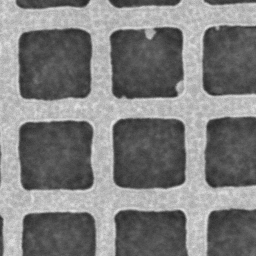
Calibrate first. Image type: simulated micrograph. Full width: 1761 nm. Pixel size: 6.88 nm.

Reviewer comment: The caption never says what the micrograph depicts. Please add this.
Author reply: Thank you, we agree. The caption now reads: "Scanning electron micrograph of holes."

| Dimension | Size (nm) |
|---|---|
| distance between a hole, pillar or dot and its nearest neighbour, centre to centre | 625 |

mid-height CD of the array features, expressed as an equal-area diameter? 80.6 px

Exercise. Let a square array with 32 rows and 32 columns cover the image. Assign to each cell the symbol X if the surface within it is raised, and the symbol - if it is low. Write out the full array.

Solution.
XX---------XXX--------XXXX------
XXXXXXXXXXXXXXXXXXXXXXXXXXXXXXXX
XXXXXXXXXXXXXXXXXXXXXXXXXXXXXXXX
XXXXXXXX--XXXXXXXXX---XXXX------
XX---------XXX---------XX-------
XX----------XX---------XX-------
XX----------XX---------XX-------
XX---------XXX---------XX-------
XX---------XXX---------XX-------
XX----------XX---------XX-------
XX----------XX---------XX-------
XX---------XXX---------XXX------
XXX-----XXXXXXX--XXXXXXXXXXXXXXX
XXXXXXXXXXXXXXXXXXXXXXXXXXXXXXXX
XXXXXXXXXXXXXXXXXXXXXXXXXXXXXXXX
XXX--------XXX---------XXX------
XX----------XX---------XXX------
XX----------XX---------XXX------
XX----------XX---------XX-------
XX---------XXX---------XX-------
XX---------XXX---------XX-------
XX----------XX---------XXX------
XX----------XX---------XXX------
XXX--------XXXX-------XXXXX--XXX
XXXXXXXXXXXXXXXXXXXXXXXXXXXXXXXX
XXXXXXXXXXXXXXXXXXXXXXXXXXXXXXXX
XXXXXX----XXXXX--------XXX------
-XX---------XX---------XXX------
-XX---------XX---------XXX------
-XX---------XX---------XXX------
-XX---------XX---------XXX------
-XX---------XX----------XX------